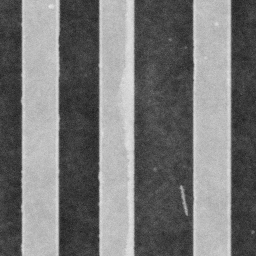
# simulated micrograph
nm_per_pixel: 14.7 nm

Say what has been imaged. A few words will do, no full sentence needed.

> lines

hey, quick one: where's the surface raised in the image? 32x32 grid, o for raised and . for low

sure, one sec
...oooo......oooo.......ooooo...
...oooo......ooo........ooooo...
...oooo......ooo........ooooo...
...oooo......ooo........ooooo...
...oooo......ooo........ooooo...
...oooo......ooo........ooooo...
...oooo......ooo........ooooo...
...oooo......ooo........ooooo...
...oooo......ooo........ooooo...
...oooo......ooo........ooooo...
...oooo......ooo........ooooo...
...oooo......ooo........ooooo...
...oooo......ooo........ooooo...
...oooo......ooo........ooooo...
...oooo......ooo........ooooo...
...oooo......ooo........ooooo...
...oooo......ooo........ooooo...
...oooo......ooo........ooooo...
...oooo......ooo........ooooo...
...oooo......oooo.......ooooo...
...oooo......oooo.......ooooo...
...oooo......oooo.......ooooo...
...oooo.....ooooo.......ooooo...
...oooo......oooo.......ooooo...
...oooo......oooo.......ooooo...
...oooo......oooo.......ooooo...
...oooo......oooo.......ooooo...
...oooo......oooo.......ooooo...
...oooo......oooo.......ooooo...
...oooo......oooo.......ooooo...
...oooo......ooo........ooooo...
...oooo......ooo........ooooo...